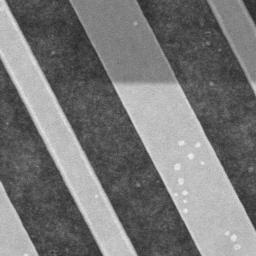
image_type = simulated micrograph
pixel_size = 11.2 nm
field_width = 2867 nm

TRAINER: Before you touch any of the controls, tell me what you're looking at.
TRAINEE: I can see lines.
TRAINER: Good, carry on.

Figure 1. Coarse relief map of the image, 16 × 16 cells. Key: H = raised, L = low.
HLLLLHHHHLLLLHHL
HLLLLHHHHLLLLLHH
HHLLLLHHHHLLLLHH
HHLLLLHHHHLLLLLH
HHHLLLLHHHHLLLLH
LHHLLLLHHHHLLLLL
LLHHLLLLHHHHLLLL
LLHHLLLLHHHHLLLL
LLLHHLLLLHHHHLLL
LLLHHLLLLHHHHLLL
LLLLHHLLLLHHHHLL
LLLLHHLLLLHHHHLL
HLLLLHHLLLLHHHHL
HLLLLHHLLLLHHHHL
HHLLLLHHLLLLHHHH
HHLLLLHHLLLLHHHH